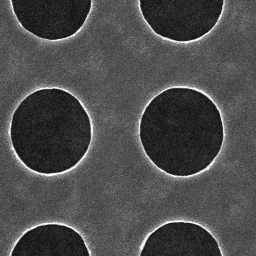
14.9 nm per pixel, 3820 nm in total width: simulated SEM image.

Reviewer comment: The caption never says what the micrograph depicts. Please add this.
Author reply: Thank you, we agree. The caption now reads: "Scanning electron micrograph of holes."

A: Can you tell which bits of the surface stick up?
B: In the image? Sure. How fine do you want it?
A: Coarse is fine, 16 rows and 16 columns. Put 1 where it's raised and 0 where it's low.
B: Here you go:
1000001110000011
1000011110000111
1111111111101111
1111111111111111
1111111111111111
1111111111101111
1000011110000111
1000001110000011
1000001110000011
1000011110000011
1100111111000111
1111111111111111
1111111111111111
1111111111111111
1100011111000111
1000011110000011